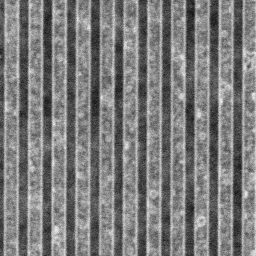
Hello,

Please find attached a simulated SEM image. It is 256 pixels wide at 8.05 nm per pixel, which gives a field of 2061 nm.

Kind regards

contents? parallel lines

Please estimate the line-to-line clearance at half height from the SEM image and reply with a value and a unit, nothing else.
78.5 nm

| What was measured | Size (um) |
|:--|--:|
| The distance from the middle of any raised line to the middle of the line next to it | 0.191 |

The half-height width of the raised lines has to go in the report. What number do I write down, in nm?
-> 111